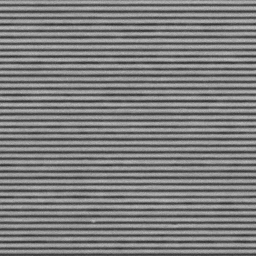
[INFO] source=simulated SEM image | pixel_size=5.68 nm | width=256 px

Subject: parallel lines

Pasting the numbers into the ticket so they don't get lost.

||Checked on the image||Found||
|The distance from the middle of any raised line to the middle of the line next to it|36.3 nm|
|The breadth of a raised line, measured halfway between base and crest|21.3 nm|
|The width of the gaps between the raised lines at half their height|16.3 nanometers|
